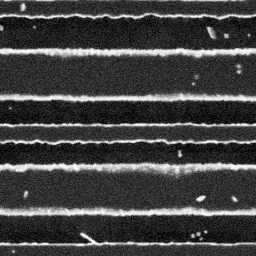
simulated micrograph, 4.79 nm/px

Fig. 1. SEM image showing lines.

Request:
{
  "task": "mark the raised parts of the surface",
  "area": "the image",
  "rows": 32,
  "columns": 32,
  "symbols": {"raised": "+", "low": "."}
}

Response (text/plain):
++++++++++++++++++++++++++++++++
++++++++++++++++++++++++++++++++
................................
................................
................................
................................
+++++++++++++++++..+++++...+++++
++++++++++++++++++++++++++++++++
++++++++++++++++++++++++++++++++
++++++++++++++++++++++++++++++++
++++++++++++++++++++++++++++++++
++++++++++++++++++++++++++++++++
................................
................................
................................
......................++........
++++++++++++++++++++++++++++++++
++++++++++++++++++++++++++++++++
................................
................................
................................
++++++++++++++++++++++++++++++++
++++++++++++++++++++++++++++++++
++++++++++++++++++++++++++++++++
++++++++++++++++++++++++++++++++
++++++++++++++++++++++++++++++++
++++++++++++++++++++++++++++++++
................................
................................
................................
+.++++.....++++++++++++++++..+++
++++++++++++++++++++++++++++++++